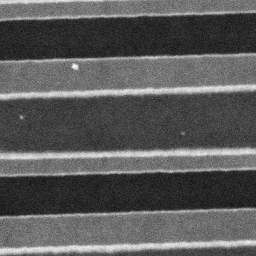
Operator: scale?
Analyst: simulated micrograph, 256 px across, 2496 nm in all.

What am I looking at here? lines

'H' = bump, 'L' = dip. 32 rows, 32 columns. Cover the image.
HHHHHHHHHHHHHHHHHHHHHHHHHHHHHHHH
HHHHHHHHHHHHHHHHHHHHHHHHHHHHHHHH
HLLLLLLLLLLLLLLLLLLLLLLLLLLLLLLL
LLLLLLLLLLLLLLLLLLLLLLLLLLLLLLLL
LLLLLLLLLLLLLLLLLLLLLLLLLLLLLLLL
LLLLLLLLLLLLLLLLLLLLLLLLLLLLLLLL
LLLLLLLLLLLLLLLLLLLLLLLLLLLLLLLL
LLLLLLHHHHHHHHHHHHHHHHHHHHHHHHHH
HHHHHHHHHHHHHHHHHHHHHHHHHHHHHHHH
HHHHHHHHHHHHHHHHHHHHHHHHHHHHHHHH
HHHHHHHHHHHHHHHHHHHHHHHHHHHHHHHH
HHHHHHHHHHHHLLLLLLLLLLLLLLLLLLLL
LLLLLLLLLLLLLLLLLLLLLLLLLLLLLLLL
LLLLLLLLLLLLLLLLLLLLLLLLLLLLLLLL
LLLLLLLLLLLLLLLLLLLLLLLLLLLLLLLL
LLLLLLLLLLLLLLLLLLLLLLLLLLLLLLLL
LLLLLLLLLLLLLLLLLLLLLLLLLLLLLLLL
LLLLLLLLLLLLLLLLLLLLLLLLLLLLLLLL
LLLLLLLLLLLLLLLLLLLLLLLLLLLLLLLL
LLLLLLLLLLHHHHHHHHHHHHHHHHHHHHHH
HHHHHHHHHHHHHHHHHHHHHHHHHHHHHHHH
HHHHHHHHHHHHHHHHHHLLLLLLLLLLLLLL
LLLLLLLLLLLLLLLLLLLLLLLLLLLLLLLL
LLLLLLLLLLLLLLLLLLLLLLLLLLLLLLLL
LLLLLLLLLLLLLLLLLLLLLLLLLLLLLLLL
LLLLLLLLLLLLLLLLLLLLLLLLLLLLLLLL
LLLLLLLLLLLLLLLLLLLHHHHHHHHHHHHH
HHHHHHHHHHHHHHHHHHHHHHHHHHHHHHHH
HHHHHHHHHHHHHHHHHHHHHHHHHHHHHHHH
HHHHHHHHHHHHHHHHHHHHHHHHHHHHHHHH
HHHHHHHHHHHHHHHHHHHHHHLHLLLLLLLL
LLLLLLLLLLLLLLLLLLLLLLLLLLLLLLLL